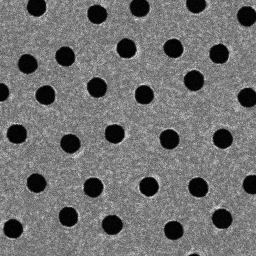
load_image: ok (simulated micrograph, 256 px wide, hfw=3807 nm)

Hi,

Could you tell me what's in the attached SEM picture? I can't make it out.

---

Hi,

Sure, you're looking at a regular array of holes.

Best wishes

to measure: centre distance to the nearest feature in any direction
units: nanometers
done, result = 666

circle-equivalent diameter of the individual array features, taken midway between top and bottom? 304 nanometers